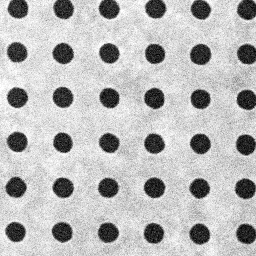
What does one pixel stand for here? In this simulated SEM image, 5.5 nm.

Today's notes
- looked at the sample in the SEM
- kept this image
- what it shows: a regular array of holes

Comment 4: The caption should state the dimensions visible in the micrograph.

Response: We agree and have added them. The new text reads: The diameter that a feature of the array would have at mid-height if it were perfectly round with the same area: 0.118 µm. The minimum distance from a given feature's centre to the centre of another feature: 0.246 micrometres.